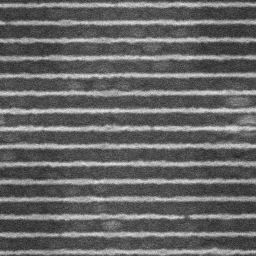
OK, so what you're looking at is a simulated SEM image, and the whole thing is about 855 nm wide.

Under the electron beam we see parallel lines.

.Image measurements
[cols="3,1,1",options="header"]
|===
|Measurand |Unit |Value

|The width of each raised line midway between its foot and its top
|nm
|10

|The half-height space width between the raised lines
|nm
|49.2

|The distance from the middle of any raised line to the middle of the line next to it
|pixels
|17.6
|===